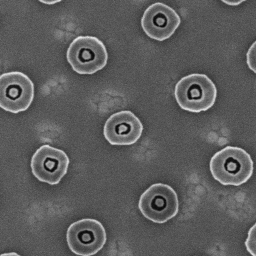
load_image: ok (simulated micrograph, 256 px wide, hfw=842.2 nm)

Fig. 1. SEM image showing ring-shaped raised bodies with a dot in the middle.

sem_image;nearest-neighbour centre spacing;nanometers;266